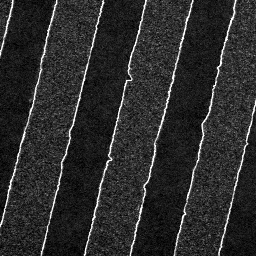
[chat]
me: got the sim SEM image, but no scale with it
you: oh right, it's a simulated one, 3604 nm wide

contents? one or a few lines or trenches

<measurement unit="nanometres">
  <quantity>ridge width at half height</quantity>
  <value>630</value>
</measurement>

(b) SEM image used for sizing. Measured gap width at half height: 588 nm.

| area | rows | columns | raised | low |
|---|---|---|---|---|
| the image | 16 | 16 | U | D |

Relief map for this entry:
UDDUUUDDDUUUDDDU
DDDUUUDDDUUUDDUU
DDDUUUDDDUUDDDUU
DDDUUUDDUUUDDDUU
DDDUUDDDUUUDDDUU
DDUUUDDDUUUDDUUU
DDUUUDDDUUDDDUUU
DDUUUDDUUUDDDUUU
DUUUDDDUUUDDDUUD
DUUUDDDUUUDDUUUD
DUUUDDDUUDDDUUUD
DUUUDDUUUDDDUUUD
UUUDDDUUUDDDUUUD
UUUDDDUUUDDUUUDD
UUUDDDUUDDDUUUDD
UUUDDUUUDDDUUUDD